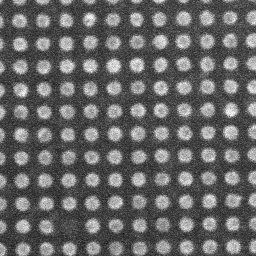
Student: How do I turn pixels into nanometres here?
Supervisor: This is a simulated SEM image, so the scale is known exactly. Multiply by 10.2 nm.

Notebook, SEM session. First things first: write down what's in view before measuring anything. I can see a regular array of raised bodies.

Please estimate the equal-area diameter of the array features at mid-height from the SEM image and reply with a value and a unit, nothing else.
123 nm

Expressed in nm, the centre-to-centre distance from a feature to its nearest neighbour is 230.